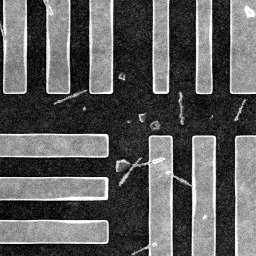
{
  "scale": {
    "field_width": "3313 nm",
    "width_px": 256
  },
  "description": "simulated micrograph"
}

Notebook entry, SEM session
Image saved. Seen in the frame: groups of lines, slits or small figures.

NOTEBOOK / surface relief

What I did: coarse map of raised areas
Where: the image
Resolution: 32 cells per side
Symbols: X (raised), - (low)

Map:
XXX---XXX--XXX-----XX----X---XXX
XXX---XXX--XXX-----XX----X---XXX
-XX---XXX--XXX-----XX----X---XXX
-XX---XXX--XXX-----XX----X---XXX
XXX---XXX--XXX-----XX----X---XXX
-XX---XXX--XXX-----XX----X---XXX
-XX---XXX--XXX-----XX----X---XXX
-XX---XXX--XXX-----XX----X---XXX
-XX---XXX--XXX-----XX----X---XXX
XXX---XXX--XXX-----XX----XX--XXX
XXX---XXX--XXX-----XX----XX--XXX
-XX---XXX--XXX-----XX----X---XXX
--------------------------------
--------------------------------
--------------------------------
--------------------------------
--------------------------------
XXXXXXXXXXXXXX-----XX---XXX--XXX
XXXXXXXXXXXXXX-----XXX--XXX--XXX
XXXXXXXXXXXXX------XXX--XXX--XXX
-------------------XXX--XXX--XXX
-------------------XXX--XXX--XXX
XXXXXXXXXXXXX------XXX--XXX--XXX
XXXXXXXXXXXXX------XX---XXX--XXX
XXXXXXXXXXXXX------XX---XXX--XXX
-------------------XX---XXX--XXX
-------------------XX---XXX--XXX
-------------------XX---XXX--XXX
XXXXXXXXXXXXXX-----XX---XXX--XXX
XXXXXXXXXXXXXX-----XX---XXX--XXX
-------------------XX---XXX---XX
-------------------XXX--XXX--XXX